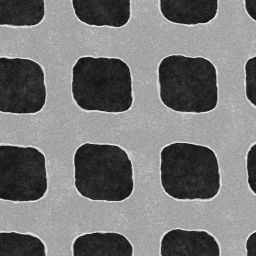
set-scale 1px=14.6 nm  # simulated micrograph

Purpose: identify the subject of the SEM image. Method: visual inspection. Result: holes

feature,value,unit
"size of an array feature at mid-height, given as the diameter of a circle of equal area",0.892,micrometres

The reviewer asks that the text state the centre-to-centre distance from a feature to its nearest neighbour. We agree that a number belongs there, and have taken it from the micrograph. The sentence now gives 1260 nm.